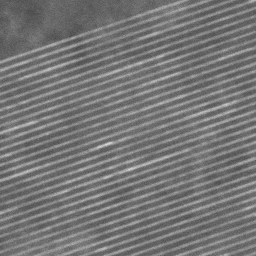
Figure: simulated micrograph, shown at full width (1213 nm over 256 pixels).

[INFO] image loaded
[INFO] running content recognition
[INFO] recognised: parallel lines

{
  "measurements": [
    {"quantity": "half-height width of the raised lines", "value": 11.3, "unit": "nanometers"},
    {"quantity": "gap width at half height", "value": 24.7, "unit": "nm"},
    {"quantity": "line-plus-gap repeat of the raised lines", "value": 35.5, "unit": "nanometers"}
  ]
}